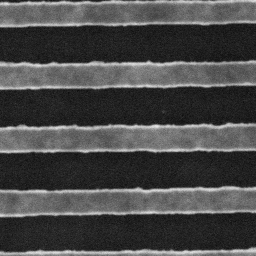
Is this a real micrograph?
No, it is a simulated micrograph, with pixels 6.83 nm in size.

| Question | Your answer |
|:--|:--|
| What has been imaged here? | lines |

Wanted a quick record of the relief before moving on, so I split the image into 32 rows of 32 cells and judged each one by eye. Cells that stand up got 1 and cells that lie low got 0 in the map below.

11111111111111111111111111111111
11111111111111111111111111111111
11111111111111111111111111111111
00000000000000000000000000000000
00000000000000000000000000000000
00000000000000000000000000000000
00000000000000000000000000000000
00000000000000000000000000000000
11111111111111111111111111111111
11111111111111111111111111111111
11111111111111111111111111111111
00000000000000000000000000000000
00000000000000000000000000000000
00000000000000000000000000000000
00000000000000000000000000000000
00000000000000000000000000000000
11111111111111111111111111111111
11111111111111111111111111111111
11111111111111111111111111111111
00000000000000000000000000000000
00000000000000000000000000000000
00000000000000000000000000000000
00000000000000000000000000000000
00000000000000000000000011011101
11111111111111111111111111111111
11111111111111111111111111111111
11111111111111111111111111111101
00000000000000000000000000000000
00000000000000000000000000000000
00000000000000000000000000000000
00000000000000000000000000000000
00011111111111111111111111111111